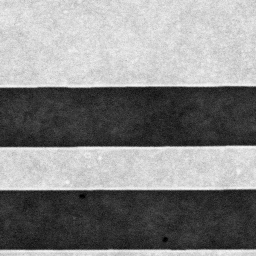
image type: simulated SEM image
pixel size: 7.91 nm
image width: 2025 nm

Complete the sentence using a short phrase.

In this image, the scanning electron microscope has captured wiring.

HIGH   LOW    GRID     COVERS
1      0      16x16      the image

1111111111111111
1111111111111111
1111111111111111
1111111111111111
1111111111111111
0000000000000000
0000000000000000
0000000000000000
0000000000000000
1111111111111111
1111111111111111
1111111111111111
0000000000000000
0000000000000000
0000000000000000
0000000000000000